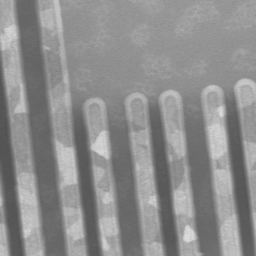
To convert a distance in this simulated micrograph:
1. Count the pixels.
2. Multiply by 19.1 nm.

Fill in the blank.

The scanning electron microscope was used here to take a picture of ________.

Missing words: parallel lines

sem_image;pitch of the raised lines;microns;0.759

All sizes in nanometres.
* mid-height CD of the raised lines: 391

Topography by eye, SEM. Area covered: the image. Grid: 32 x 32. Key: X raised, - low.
XX---XX-------------------------
XX---XX-------------------------
XX---XX-------------------------
XX---XXX------------------------
XX---XXX------------------------
XX---XXX------------------------
XXX--XXX------------------------
XXX--XXX------------------------
XXX---XX------------------------
XXX---XX------------------------
XXX---XX----------------------XX
-XX---XX------------------XX--XX
-XX---XXX-------XX--XX---XXX--XX
-XX---XXX--XX---XX--XXX--XXX--XX
-XX---XXX--XX---XX--XXX---XX--XX
-XXX--XXX--XX---XXX-XXX---XX--XX
-XXX---XX--XX---XXX--XX---XX--XX
-XXX---XX--XX---XXX--XX---XX--XX
-XXX---XX--XXX--XXX--XX---XXX-XX
--XX---XX--XXX---XX--XX---XXX-XX
--XX---XXX-XXX---XX--XX---XXX--X
--XX---XXX-XXX---XX--XXX--XXX--X
--XX---XXX--XX---XX--XXX---XX--X
--XXX--XXX--XX---XXX-XXX---XX--X
--XXX--XXX--XX---XXX-XXX---XX--X
--XXX---XX--XX---XXX-XXX---XX--X
X-XXX---XX--XXX--XXX--XX---XXX-X
X-XXX---XX--XXX--XXX--XX---XXX-X
X--XX---XXX-XXX---XX--XX---XXX--
X--XX---XXX-XXX---XX--XXX--XXX--
X--XX---XXX-XXX---XX--XXX---XX--
X--XX---XXX--XX---XXX-XXX---XX--